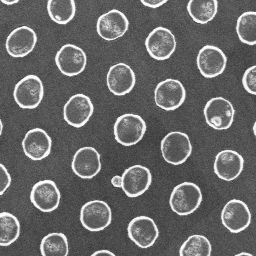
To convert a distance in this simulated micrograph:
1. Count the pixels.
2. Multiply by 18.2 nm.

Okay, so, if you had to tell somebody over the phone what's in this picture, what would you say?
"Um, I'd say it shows a regular array of raised bodies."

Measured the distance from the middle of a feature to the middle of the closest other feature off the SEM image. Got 940 nm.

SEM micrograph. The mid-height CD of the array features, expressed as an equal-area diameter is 536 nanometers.